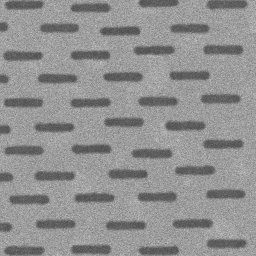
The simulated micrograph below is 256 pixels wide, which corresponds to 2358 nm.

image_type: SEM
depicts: a regular array of holes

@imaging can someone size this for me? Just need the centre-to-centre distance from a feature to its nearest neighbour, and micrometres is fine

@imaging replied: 0.354